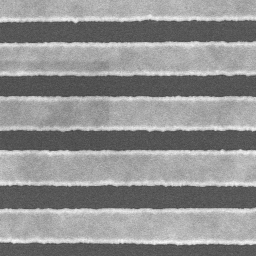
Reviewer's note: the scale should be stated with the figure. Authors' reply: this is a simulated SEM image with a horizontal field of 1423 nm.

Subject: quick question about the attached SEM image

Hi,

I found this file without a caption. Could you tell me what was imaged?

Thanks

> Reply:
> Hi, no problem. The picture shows lines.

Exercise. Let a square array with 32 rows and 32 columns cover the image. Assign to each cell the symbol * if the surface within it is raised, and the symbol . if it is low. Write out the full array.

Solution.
********************************
********************************
******************.*************
................................
................................
********************************
********************************
********************************
********************************
................................
................................
................................
********************************
********************************
********************************
********************************
................................
................................
................................
********************************
********************************
********************************
********************************
................................
................................
................................
********************************
********************************
********************************
********************************
...................*..**....*.**
................................